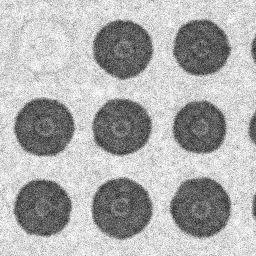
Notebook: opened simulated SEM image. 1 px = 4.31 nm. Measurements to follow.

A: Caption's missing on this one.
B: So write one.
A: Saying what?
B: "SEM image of a regular array of ring-shaped grooves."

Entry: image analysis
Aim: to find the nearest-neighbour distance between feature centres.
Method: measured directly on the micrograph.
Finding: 0.337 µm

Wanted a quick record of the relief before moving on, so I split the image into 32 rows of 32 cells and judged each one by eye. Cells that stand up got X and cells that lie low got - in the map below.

XXXXXXXXXXXXXXXXXXXXXXXXXXXXXXXX
XXXXXXXXXXXXXXXXXXXXXXXXXXXXXXXX
XXX----XXXXXXX---XXXXXX----XXXXX
XX-------XXX------XXXX------XXXX
XX-------XXX-------XXX------XXXX
XX---X---XX----X---XX----X---XX-
XX---X---XX----X---XX----X---XX-
XX-------XXX-------XXX-------XX-
XXX-----XXXX------XXXX------XXXX
XXXXX--XXXXXXX---XXXXXXX--XXXXXX
XXXXXXXXXXXXXXXXXXXXXXXXXXXXXXXX
XXXXXXXXXXXXXXXXXXXXXXXXXXXXXXXX
XXXX---XXXXXX----XXXXXXX--XXXXXX
XX-------XXX------XXXX------XXXX
XX-------XXX-------XXX------XXX-
XX---X----X---XX---XX---XX--XXX-
XX---X---XX---XX---XX---XX---XX-
XX-------XXX-------XXX------XXX-
XXX-----XXXX------XXXX------XXXX
XXXX---XXXXXXX--XXXXXXXXXXXXXXXX
XXXXXXXXXXXXXXXXXXXXXXXXXXXXXXXX
XXXXXXXXXXXXXXXXXXXXXXXXXXXXXXXX
XXXX---XXXXXX----XXXXXX----XXXXX
XX------XXXX------XXXX------XXXX
XX-------XXX-------XXX-------XXX
XX---X---XX---XX---XX----X---XX-
XX---X---XX---XX---XX---XX---XX-
XX-------XX--------XX--------XXX
XX------XXXX-------XXX------XXXX
XXXX---XXXXXX----XXXXXX----XXXXX
XXXXXXXXXXXXXXXXXXXXXXXXXXXXXXXX
XXXXXXXXXXXXXXXXXXXXXXXXXXXXXXXX